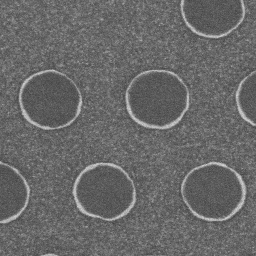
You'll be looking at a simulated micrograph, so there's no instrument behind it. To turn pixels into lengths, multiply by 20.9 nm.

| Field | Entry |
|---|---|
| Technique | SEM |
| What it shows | raised bodies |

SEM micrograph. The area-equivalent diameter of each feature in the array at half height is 1250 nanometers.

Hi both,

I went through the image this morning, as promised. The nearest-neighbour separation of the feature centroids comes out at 2.23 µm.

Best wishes